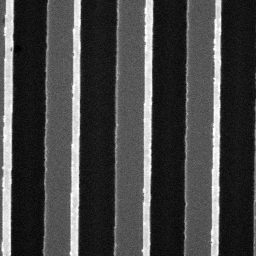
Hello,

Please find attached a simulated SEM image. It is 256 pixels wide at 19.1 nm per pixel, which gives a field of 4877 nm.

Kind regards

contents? lines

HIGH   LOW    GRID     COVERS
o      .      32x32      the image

oo....oooo.....oooo....ooooo....
oo....oooo.....oooo....ooooo....
oo....oooo.....oooo....ooooo....
oo....oooo.....oooo....ooooo....
oo....oooo.....oooo....ooooo....
oo....oooo.....oooo....oooo.....
oo....oooo.....oooo....oooo.....
o.....oooo.....oooo....ooooo....
o.....oooo.....oooo....ooooo....
o.....oooo.....oooo....oooo.....
o.....oooo.....oooo....oooo.....
o.....oooo.....oooo....oooo.....
o.....oooo.....oooo....oooo.....
o.....oooo.....oooo....oooo.....
o.....oooo.....oooo....oooo.....
o.....oooo.....oooo....oooo.....
o.....oooo.....oooo....oooo.....
o.....oooo.....oooo....oooo.....
o.....oooo.....oooo....oooo.....
o.....oooo.....oooo....oooo.....
o.....oooo.....oooo....oooo.....
o.....oooo.....oooo....oooo.....
o.....oooo.....oooo....oooo.....
o.....oooo.....oooo....oooo.....
o.....oooo.....oooo....oooo.....
o.....oooo.....oooo....oooo.....
o.....oooo.....oooo....oooo.....
o.....oooo....ooooo....oooo.....
o.....oooo....ooooo....oooo.....
o.....oooo....ooooo....oooo.....
o.....oooo....ooooo....oooo.....
o....ooooo....ooooo....oooo.....